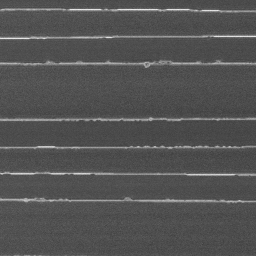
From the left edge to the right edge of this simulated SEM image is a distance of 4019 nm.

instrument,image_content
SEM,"lines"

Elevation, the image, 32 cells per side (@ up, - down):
--------------------------------
@@@@@@@@@@@@@@@@@@@@@@@@@@@@@@@@
@@@@@@@@@@@@@@@@@@@@@@@@@@@@@@@@
@@@@@@@@@@@@@@@@@@@@@@@@@@@@@@@@
@@@@@@@@@@@@@@@@@@@@@@@@@@------
--------------------------------
--------------------------------
--------------------------------
@@@@@@@@@@@@@@@@@@@@@@@@@@@@@@@@
@@@@@@@@@@@@@@@@@@@@@@@@@@@@@@@@
@@@@@@@@@@@@@@@@@@@@@@@@@@@@@@@@
@@@@@@@@@@@@@@@@@@@@@@@@@@@@@@@@
@@@@@@@@@@@@@@@@@@@@@@@@@@@@@@@@
@@@@@@@@@@@@@@@@@@@@@@@@@@@@@@@@
@@@@@@@@@@@@@@@@@@@@@@@@@@@@@@@@
--------------------------------
--------------------------------
--------------------------------
@@@@@@@@@@@@@@@@@@@@@@@@@@@@@@@@
@@@@@@@@@@@@@@@@@@@@@@@@@@@@@@@@
@@@@@@@@@@@@@@@@@@@@@@@@@@@@@@@@
@@@@@@@@@@@@@@@@@@@@@@@@@@@@@@@@
--------------------------------
--------------------------------
--------------------------------
@@@@@@@@@@@@@@@@@@@@@@@@@@@@@@@@
@@@@@@@@@@@@@@@@@@@@@@@@@@@@@@@@
@@@@@@@@@@@@@@@@@@@@@@@@@@@@@@@@
@@@@@@@@@@@@@@@@@@@@@@@@@@@@@@@@
@@@@@@@@@@@@@@@@@@@@@@@@@@@@@@@@
@@@@@@@@@@@@@@@@@@@@@@@@@@@@@@@@
@@@@@@@@@@@@@@@@@@@@@@@@@@@@@@@@